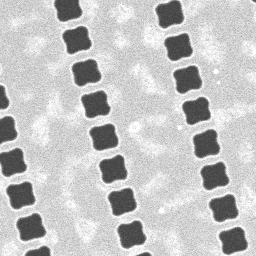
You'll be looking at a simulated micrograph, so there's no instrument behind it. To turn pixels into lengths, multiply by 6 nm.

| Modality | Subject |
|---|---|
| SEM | a regular array of holes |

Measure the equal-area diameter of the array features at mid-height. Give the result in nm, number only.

160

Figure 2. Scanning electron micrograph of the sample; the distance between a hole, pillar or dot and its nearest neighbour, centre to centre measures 200 nm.